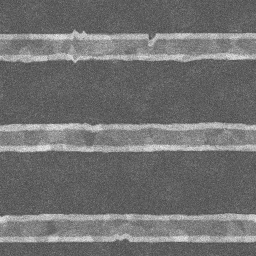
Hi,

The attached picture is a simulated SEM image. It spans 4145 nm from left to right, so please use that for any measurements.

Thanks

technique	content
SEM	one or a few lines or trenches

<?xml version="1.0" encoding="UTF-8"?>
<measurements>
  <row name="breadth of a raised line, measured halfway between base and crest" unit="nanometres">340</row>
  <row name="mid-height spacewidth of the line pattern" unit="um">1.13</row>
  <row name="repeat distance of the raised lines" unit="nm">1470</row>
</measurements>